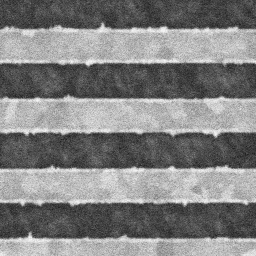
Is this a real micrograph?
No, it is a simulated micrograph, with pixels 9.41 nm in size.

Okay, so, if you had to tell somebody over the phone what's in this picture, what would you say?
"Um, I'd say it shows one or a few lines or trenches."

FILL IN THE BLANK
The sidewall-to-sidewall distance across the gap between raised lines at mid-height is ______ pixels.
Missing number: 36.2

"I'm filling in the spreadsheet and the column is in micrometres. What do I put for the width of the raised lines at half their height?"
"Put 0.318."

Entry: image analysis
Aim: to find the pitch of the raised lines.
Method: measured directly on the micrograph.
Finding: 70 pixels